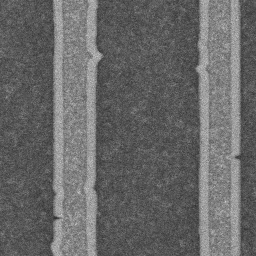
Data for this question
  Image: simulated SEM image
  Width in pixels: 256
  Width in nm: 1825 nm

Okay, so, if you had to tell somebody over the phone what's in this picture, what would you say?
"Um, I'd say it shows one or a few lines or trenches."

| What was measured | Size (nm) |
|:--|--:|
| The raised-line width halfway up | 220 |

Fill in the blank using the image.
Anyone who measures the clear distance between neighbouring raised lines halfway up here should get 114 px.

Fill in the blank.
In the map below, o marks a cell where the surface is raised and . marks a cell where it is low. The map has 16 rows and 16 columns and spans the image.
....oo.......oo.
....oo.......oo.
....oo.......oo.
....oo.......oo.
....oo.......oo.
....oo.......oo.
....oo.......oo.
....oo.......oo.
....oo.......oo.
....oo.......oo.
....oo.......oo.
....oo.......oo.
....oo.......oo.
....oo.......oo.
....oo.......oo.
....oo.......oo.